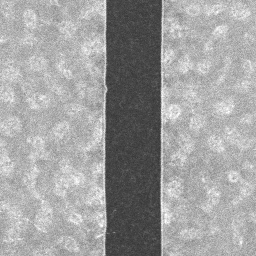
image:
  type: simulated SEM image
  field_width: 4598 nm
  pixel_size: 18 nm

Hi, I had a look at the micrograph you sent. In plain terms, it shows one or a few lines or trenches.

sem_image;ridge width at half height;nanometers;1040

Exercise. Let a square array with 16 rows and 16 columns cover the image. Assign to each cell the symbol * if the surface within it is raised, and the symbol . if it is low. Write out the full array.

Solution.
.......***......
.......***......
.......***......
.......***......
.......***......
.......***......
.......***......
.......***......
.......***......
.......***......
.......***......
.......***......
.......***......
.......***......
.......***......
.......***......